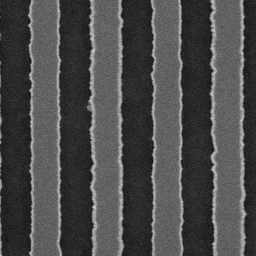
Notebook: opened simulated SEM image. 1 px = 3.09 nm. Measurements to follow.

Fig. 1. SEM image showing lines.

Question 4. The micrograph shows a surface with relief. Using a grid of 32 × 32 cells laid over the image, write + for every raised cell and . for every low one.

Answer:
....+++....++++....++++...++++..
....+++....++++....++++....+++..
....+++....++++....++++...+++++.
....+++....++++....++++...+++++.
....+++....++++....++++....++++.
....+++....++++....++++...++++..
....+++....++++....++++....+++..
....++++...++++....++++...+++++.
....+++....++++....++++...++++..
....+++....++++....++++....+++..
....+++....++++....++++....+++..
....+++....++++....++++...++++..
....+++....++++....++++....+++..
....+++....++++....++++...++++..
....++++....+++....++++...+++++.
....+++....++++....++++....+++..
....+++....++++....++++...++++..
....+++....++++....++++....+++..
....+++....++++....++++....+++..
....+++....++++....++++...++++..
....++++....+++....++++....++++.
....++++...++++....++++....++++.
....++++....+++....++++....+++..
....+++....++++....++++....++++.
....++++....+++....++++....++++.
....++++....+++....++++....+++..
....++++....+++....++++....++++.
....++++....+++....++++....++++.
....++++....+++....++++....++++.
....++++....+++....++++....++++.
....+++.....+++....++++....++++.
....++++....+++....++++....++++.